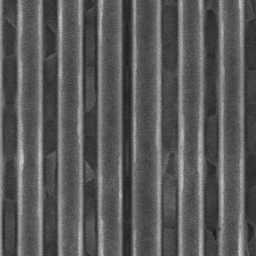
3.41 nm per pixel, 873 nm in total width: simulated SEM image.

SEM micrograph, parallel lines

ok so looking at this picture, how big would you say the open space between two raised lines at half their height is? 56.8 nm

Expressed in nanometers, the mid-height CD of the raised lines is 79.8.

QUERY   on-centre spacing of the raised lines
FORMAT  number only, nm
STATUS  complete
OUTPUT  138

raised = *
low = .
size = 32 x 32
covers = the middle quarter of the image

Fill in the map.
****.....*****...*******.....***
****.....*****...*******.....***
****.....*****...*******.....***
****.....*****...*******.....***
****.....*****...*******.....***
****.....*****...*******.....***
****.....*****...*******.....***
****.....*****...*******.....***
****.....*****...*******.....***
****.....*****...*******.....***
****.....*****...*******.....***
****.....*****...*******.....***
****.....*****...*******.....***
****.....*****...*******.....***
****.....*****...*******.....***
****.....*****...*******.....***
****.....*****...*******.....***
****.....*****...*******.....***
****.....*****...*******.....***
****.....*****...*******.....***
****.....*****...*******.....***
****.....*****...*******.....***
****.....*****...*******.....***
****.....*****...*******.....***
****.....*****...*******.....***
****.....*****...*******.....***
****.....*****...*******.....***
****.....*****...*******.....***
****.....*****...*******.....***
****.....*****...*******.....***
****.....*****...*******.....***
****.....*****...*******.....***